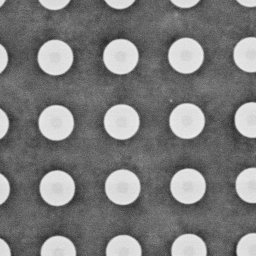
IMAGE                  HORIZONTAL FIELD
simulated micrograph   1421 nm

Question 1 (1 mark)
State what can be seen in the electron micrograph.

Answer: an array of small figures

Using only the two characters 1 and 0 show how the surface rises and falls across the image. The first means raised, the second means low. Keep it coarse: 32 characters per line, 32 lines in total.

00000111000000110000001100000011
00000000000000000000000000000000
00000000000000000000000000000000
00000000000000000000000000000000
00000000000000000000000000000000
00000011000000111000001110000011
10000111100001111000011110000111
10000111100001111000011110000111
10000111100001111000001110000011
00000000000000000000000000000000
00000000000000000000000000000000
00000000000000000000000000000000
00000000000000000000000000000000
00000011000000110000001110000011
10000111100001111000011110000111
10000111100001111000011110000111
10000111100001111000001110000011
00000000000000000000000000000000
00000000000000000000000000000000
00000000000000000000000000000000
00000000000000000000000000000000
00000011000000110000001110000011
10000111100001111000011110000011
10000111100001111000011111000011
10000111100001111000001110000011
00000011000000010000000000000000
00000000000000000000000000000000
00000000000000000000000000000000
00000000000000000000000000000000
00000000000000010000000110000001
10000011100000111000001111000011
10000111100001111100001111000011